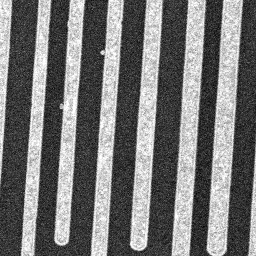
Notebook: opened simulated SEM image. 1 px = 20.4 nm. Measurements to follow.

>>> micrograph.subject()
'parallel lines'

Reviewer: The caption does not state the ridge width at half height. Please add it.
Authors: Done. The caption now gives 294 nanometres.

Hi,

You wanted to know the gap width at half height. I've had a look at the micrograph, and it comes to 485 nanometers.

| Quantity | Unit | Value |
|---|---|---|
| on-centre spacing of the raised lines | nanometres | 765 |